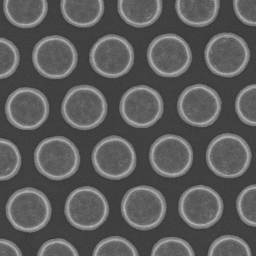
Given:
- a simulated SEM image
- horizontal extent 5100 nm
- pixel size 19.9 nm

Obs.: a regular array of raised bodies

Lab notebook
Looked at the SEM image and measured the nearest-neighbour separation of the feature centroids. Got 1140 nm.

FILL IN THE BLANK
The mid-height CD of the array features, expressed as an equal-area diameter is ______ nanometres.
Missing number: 810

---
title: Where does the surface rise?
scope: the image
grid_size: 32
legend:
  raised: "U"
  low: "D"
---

DUUUUUDDUUUUUDDUUUUUDDUUUUUDDUUU
DUUUUUDDUUUUUDDUUUUUDDUUUUUDDDUU
DUUUUDDDDUUUDDDDUUUDDDDUUUDDDDUU
DDDDDDDDDDDDDDDDDDDDDDDDDDDDDDDD
DDDDDDDDDDDDDDDDDDDDDUDDDDDUUDDD
UDDDDUUUUDDDUUUUDDDUUUUDDDUUUUUD
UUDDUUUUUDDDUUUUDDDUUUUUDDUUUUUD
UUDDUUUUUDDUUUUUDDDUUUUUDDUUUUUD
UUDDDUUUUDDDUUUUDDDUUUUDDDUUUUDD
DDDDDDUUDDDDDDDDDDDDDDDDDDDDDDDD
DDDDDDDDDDDDDDDDDDDDDDDDDDDDDDDD
DDUUUDDDDUUUDDDDUUUDDDDUUUUDDDUU
DUUUUUDDUUUUUDDUUUUUDDDUUUUDDDUU
DUUUUUDDUUUUUDDUUUUUDDUUUUUDDDUU
DUUUUUDDUUUUUDDUUUUUDDDUUUUDDDUU
DDUUUDDDDUUUDDDDDUUDDDDDUUDDDDDU
DDDDDDDDDDDDDDDDDDDDDDDDDDDDDDDD
DDDDDDUUDDDDDUUDDDDDUUUDDDDUUUDD
UUDDDUUUUDDDUUUUDDDUUUUUDDUUUUUD
UUDDDUUUUUDDUUUUUDDUUUUUDDUUUUUD
UUDDDUUUUUDDUUUUUDDUUUUUDDUUUUUD
UUDDDUUUUDDDDUUUDDDDUUUDDDDUUUDD
DDDDDDDDDDDDDDDDDDDDDDDDDDDDDDDD
DDDDDDDDDDDDDDDDDUDDDDDDUUDDDDDU
DDUUUDDDDUUUUDDDUUUUDDDUUUUDDDUU
DUUUUUDDUUUUUDDUUUUUDDDUUUUUDDUU
DUUUUUDDUUUUUDDUUUUUDDDUUUUUDDUU
DUUUUUDDDUUUUDDDUUUUDDDUUUUDDDDU
DDUUUDDDDDUDDDDDDDUDDDDDDDDDDDDD
DDDDDDDDDDDDDDDDDDDDDDDDDDDDDDDD
UDDDDDUUUDDDDUUUDDDDUUUDDDDUUUUD
UUDDDUUUUDDDUUUUUDDUUUUUDDUUUUUD